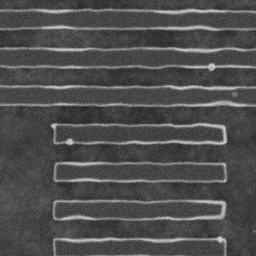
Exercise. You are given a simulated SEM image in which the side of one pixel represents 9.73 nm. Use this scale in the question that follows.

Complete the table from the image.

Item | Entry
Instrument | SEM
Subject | groups of lines, slits or small figures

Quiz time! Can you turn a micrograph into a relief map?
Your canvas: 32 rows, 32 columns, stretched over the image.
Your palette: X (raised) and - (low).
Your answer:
--------------------------------
XXXXXXXXXXXXXXXXXXXX--XXXXXXXXXX
XXXXXXXXXXXXXXXXXXXXXXXXXXXXXXXX
XXXXX----XXXXXXXXXXXXXXX--XXXXXX
--------------------------------
--------------------------------
XXXXXXXXXXXXXXXXXXXXXXXXXXXXXXXX
XXXXXXXXXXXXXXXXXXXXXXXXXXXXXXXX
------------------XX------X-----
--------------------------------
--------------------------------
XXXXXXXXXXXXXXXXXXXXXXXXXXXXXXXX
XXXXXXXXXXXXXXXXXXXXXXXXXXXXXXXX
--------------------------------
--------------------------------
--------------------------------
-------XXXXXXXXXXXXXXXXXXXXX----
-------XXXXXXXXXXXXXXXXXXXXX----
--------------------------------
--------------------------------
-------XX--XXXXXXXXX-XXXX-------
-------XXXXXXXXXXXXXXXXXXXXX----
-------XXX-XXXXXXXXXXXXXXXXX----
--------------------------------
--------------------------------
-------XXXXXXXXXXXXXXXXXXXXX----
-------XXXXXXXXXXXXXXXXXXXXX----
--------------------------------
--------------------------------
--------------------------------
-------XXXXXXXXXXXXXXXXXXXXX----
-------XXXXXXXXXXXXXXXXXXXXX----